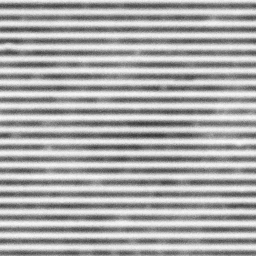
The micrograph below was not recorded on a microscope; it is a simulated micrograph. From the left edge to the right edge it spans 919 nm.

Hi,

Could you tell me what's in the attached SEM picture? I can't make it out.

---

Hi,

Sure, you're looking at parallel lines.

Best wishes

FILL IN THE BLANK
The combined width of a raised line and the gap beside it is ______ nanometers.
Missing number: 42.4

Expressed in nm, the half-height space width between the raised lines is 26.5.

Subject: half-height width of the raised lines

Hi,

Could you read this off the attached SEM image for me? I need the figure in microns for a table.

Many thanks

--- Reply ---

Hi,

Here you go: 0.0166